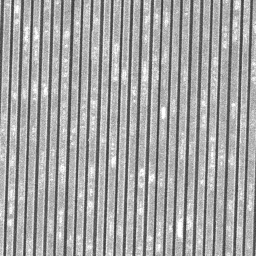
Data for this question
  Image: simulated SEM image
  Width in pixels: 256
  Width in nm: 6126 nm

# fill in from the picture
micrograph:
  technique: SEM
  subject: parallel lines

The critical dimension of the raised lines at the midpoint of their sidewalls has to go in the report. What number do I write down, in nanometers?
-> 158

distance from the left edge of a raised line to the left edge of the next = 238 nm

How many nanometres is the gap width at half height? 68.8